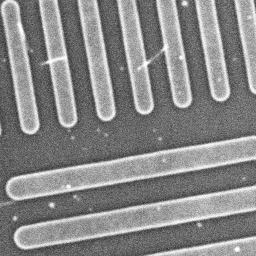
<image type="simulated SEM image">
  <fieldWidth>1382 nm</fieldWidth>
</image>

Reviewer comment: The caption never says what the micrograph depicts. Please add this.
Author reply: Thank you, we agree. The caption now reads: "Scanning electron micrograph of groups of lines, slits or small figures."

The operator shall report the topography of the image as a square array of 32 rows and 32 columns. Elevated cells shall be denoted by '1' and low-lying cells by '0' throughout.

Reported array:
11000110001100011000110001100111
11000110001100011000110001100011
11100111001100011000110001100011
01100111001110011000110001100011
01100011000110011100111001100011
01100011000110001100011001110011
01100011000110001100011000110001
01100011000110001100011000110001
00110011100110001100011000110001
00110011100111001110011000110001
00110001100011000110011100111001
00110001100011000110001100111000
00110001100011000110001100010000
00111001100011000110000000000000
00111001110011000000000000000000
00011000100000000000000000000000
00010000000000000000000000000000
00000000000000000000000000000111
00000000000000000000000111111111
00000000000000000111111111111111
00000000000011111111111111110000
00000011111111111111111000000000
01111111111111111000000000000000
01111111111000000000000000000001
01111000000000000000000001111111
00000000000000000001111111111111
00000000000001111111111111111100
00000001111111111111111100000000
00011111111111111110000000000000
00111111111110000000000000000000
00111110000000000000000000011111
00000000000000000000011111111111